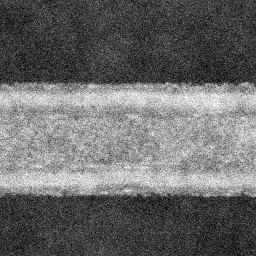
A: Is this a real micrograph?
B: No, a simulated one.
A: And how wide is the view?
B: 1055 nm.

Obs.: one or a few lines or trenches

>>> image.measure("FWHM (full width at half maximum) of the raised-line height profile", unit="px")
81.5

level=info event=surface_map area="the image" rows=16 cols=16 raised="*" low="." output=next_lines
................
................
................
................
................
................
****************
****************
****************
****************
****************
................
................
................
................
................